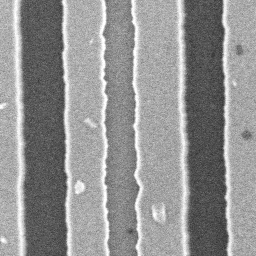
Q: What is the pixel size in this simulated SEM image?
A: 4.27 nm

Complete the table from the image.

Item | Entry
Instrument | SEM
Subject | lines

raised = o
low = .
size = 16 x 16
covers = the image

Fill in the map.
o...ooooooo...oo
o...ooooooo...oo
o...ooooooo...oo
o...ooooooo...oo
o...ooooooo...oo
o...ooooooo...oo
o...ooooooo...oo
o...ooooooo...oo
o...ooooooo...oo
o...oooooooo..oo
o...oooooooo..oo
o...oooooooo..oo
o...oooooooo..oo
o...oooooooo..oo
o...oooooooo..oo
o...oooooooo..oo